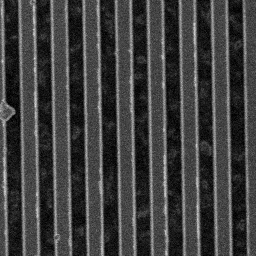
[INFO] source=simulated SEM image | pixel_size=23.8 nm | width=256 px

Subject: parallel lines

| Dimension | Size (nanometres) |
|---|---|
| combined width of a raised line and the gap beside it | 762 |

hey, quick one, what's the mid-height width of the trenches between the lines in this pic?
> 16.6 px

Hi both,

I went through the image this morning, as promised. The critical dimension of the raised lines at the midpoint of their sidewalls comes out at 372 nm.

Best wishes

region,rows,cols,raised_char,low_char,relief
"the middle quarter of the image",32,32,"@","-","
@----@@@@----@@@@----@@@@----@@@
@----@@@@----@@@@----@@@@----@@@
@----@@@@----@@@@----@@@@----@@@
@----@@@@----@@@@----@@@@----@@@
@----@@@@----@@@@----@@@@----@@@
@----@@@@----@@@@----@@@@----@@@
@----@@@@----@@@@----@@@@----@@@
@----@@@@----@@@@----@@@@----@@@
@----@@@@----@@@@----@@@@----@@@
@----@@@@----@@@@----@@@@----@@@
@----@@@@----@@@@----@@@@----@@@
@----@@@@----@@@@----@@@@-----@@
@----@@@@----@@@@----@@@@-----@@
@----@@@@----@@@@----@@@@-----@@
@----@@@@----@@@@----@@@@-----@@
@----@@@@----@@@@-----@@@-----@@
@----@@@@----@@@@-----@@@-----@@
@----@@@@----@@@@-----@@@-----@@
@----@@@@----@@@@-----@@@-----@@
@----@@@@-----@@@-----@@@-----@@
@----@@@@-----@@@-----@@@-----@@
@----@@@@-----@@@-----@@@-----@@
@-----@@@-----@@@-----@@@-----@@
@-----@@@-----@@@-----@@@-----@@
@-----@@@-----@@@-----@@@-----@@
@-----@@@-----@@@-----@@@-----@@
@-----@@@-----@@@-----@@@-----@@
@-----@@@-----@@@-----@@@-----@@
@-----@@@-----@@@-----@@@-----@@
@-----@@@-----@@@-----@@@-----@@
@-----@@@-----@@@-----@@@-----@@
@@----@@@-----@@@-----@@@-----@@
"